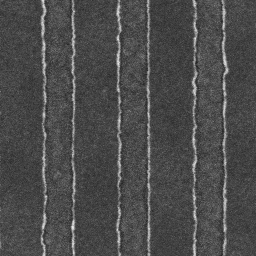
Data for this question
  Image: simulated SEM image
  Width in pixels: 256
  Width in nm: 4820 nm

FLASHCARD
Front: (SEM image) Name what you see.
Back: one or a few lines or trenches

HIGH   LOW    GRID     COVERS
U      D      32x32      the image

UUUUUDDDDUUUUUUDDDUUUUUUDDDDUUUU
UUUUUUDDDUUUUUUDDDUUUUUUUDDDUUUU
UUUUUDDDDUUUUUUDDDDUUUUUUDDDUUUU
UUUUUDDDDUUUUUUDDDDUUUUUDDDDUUUU
UUUUUDDDDUUUUUUDDDDUUUUUUDDDUUUU
UUUUUUDDDUUUUUUDDDDUUUUUDDDDUUUU
UUUUUUDDDUUUUUUDDDDUUUUUDDDDUUUU
UUUUUUDDDUUUUUUDDDDUUUUUDDDDUUUU
UUUUUDDDDUUUUUUDDDDUUUUUDDDDUUUU
UUUUUUDDDUUUUUUDDDDUUUUUUDDDUUUU
UUUUUUDDDUUUUUUDDDDUUUUUDDDDUUUU
UUUUUUDDDUUUUUUDDDUUUUUUDDDDUUUU
UUUUUUDDDUUUUUUDDDDUUUUUDDDDUUUU
UUUUUUDDDUUUUUUDDDDUUUUUDDDDUUUU
UUUUUUDDDUUUUUUDDDDUUUUUDDDDUUUU
UUUUUDDDDUUUUUUDDDDUUUUUDDDDUUUU
UUUUUUDDDUUUUUUDDDDUUUUUDDDDUUUU
UUUUUUDDDUUUUUUDDDDUUUUUDDDDUUUU
UUUUUUDDDUUUUUUDDDDUUUUUDDDDUUUU
UUUUUDDDDUUUUUUDDDDUUUUUUDDDUUUU
UUUUUUDDDUUUUUUDDDDUUUUUDDDDUUUU
UUUUUUDDDUUUUUUDDDDUUUUUDDDDUUUU
UUUUUUDDDUUUUUUDDDDUUUUUDDDDUUUU
UUUUUUDDDUUUUUUDDDDUUUUUDDDDUUUU
UUUUUUDDDUUUUUUDDDDUUUUUDDDDUUUU
UUUUUUDDDUUUUUUDDDDUUUUUDDDDUUUU
UUUUUUDDDUUUUUUDDDDUUUUUDDDDUUUU
UUUUUUDDDUUUUUUDDDDUUUUUUDDDUUUU
UUUUUDDDDUUUUUUDDDDUUUUUUDDDUUUU
UUUUUDDDDUUUUUUDDDDUUUUUDDDDUUUU
UUUUUDDDDUUUUUUDDDDUUUUUDDDDUUUU
UUUUUUDDDUUUUUUDDDUUUUUUDDDDUUUU